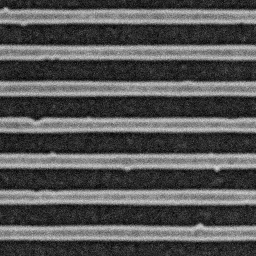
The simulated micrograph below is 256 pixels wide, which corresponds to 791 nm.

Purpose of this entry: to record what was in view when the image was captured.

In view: parallel lines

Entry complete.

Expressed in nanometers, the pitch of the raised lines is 112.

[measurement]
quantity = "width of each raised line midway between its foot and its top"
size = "36.7 nm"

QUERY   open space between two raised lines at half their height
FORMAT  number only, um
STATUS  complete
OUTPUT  0.0758